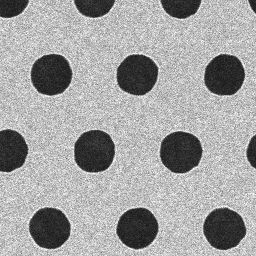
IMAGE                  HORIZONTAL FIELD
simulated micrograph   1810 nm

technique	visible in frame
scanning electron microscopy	a regular array of holes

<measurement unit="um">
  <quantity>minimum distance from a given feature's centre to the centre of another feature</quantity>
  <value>0.612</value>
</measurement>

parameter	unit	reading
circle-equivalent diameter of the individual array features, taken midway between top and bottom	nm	296